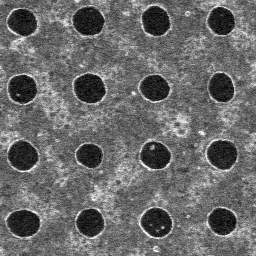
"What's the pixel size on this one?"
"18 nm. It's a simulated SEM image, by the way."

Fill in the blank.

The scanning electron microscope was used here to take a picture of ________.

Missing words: a regular array of holes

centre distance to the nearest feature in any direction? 1190 nanometers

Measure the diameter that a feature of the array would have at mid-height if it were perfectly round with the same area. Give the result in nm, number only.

540